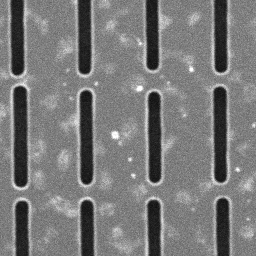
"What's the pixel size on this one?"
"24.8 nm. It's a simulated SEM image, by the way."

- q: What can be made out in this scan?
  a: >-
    holes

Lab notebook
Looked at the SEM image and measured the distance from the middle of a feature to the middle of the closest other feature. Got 1630 nm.